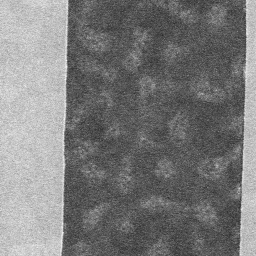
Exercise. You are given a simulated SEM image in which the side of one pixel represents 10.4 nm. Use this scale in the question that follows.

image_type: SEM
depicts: one or a few lines or trenches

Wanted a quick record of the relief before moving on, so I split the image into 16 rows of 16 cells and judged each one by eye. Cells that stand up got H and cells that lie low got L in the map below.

HHHHLLLLLLLLLLLH
HHHHLLLLLLLLLLLH
HHHHLLLLLLLLLLLH
HHHHLLLLLLLLLLLH
HHHHLLLLLLLLLLLH
HHHHLLLLLLLLLLLH
HHHHLLLLLLLLLLLH
HHHHLLLLLLLLLLLH
HHHHLLLLLLLLLLLH
HHHHLLLLLLLLLLLH
HHHHLLLLLLLLLLLH
HHHHLLLLLLLLLLLH
HHHHLLLLLLLLLLLH
HHHHLLLLLLLLLLLH
HHHHLLLLLLLLLLLH
HHHHLLLLLLLLLLLH